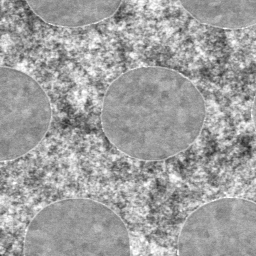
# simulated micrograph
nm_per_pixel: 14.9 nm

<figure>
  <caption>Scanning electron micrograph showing raised bodies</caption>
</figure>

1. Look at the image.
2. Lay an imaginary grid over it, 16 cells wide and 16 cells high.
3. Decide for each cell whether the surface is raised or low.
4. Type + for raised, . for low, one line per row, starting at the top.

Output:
..+++++.....++++
...+++.......+++
................
................
+.......+++.....
+++....+++++....
+.+...+++++++...
+++...+++++++...
+++....+++++....
++......+++.....
................
................
....++.......++.
..+++++.....++++
..++++++...+++++
..++++++...+++++